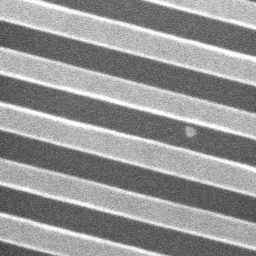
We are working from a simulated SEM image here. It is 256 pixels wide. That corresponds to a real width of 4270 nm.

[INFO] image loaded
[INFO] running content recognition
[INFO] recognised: lines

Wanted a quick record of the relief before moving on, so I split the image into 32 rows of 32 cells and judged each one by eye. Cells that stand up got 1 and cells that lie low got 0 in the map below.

11111100000000000000111111111111
11111111110000000000000011111111
11111111111111000000000000011111
00001111111111111100000000000001
00000000111111111111110000000000
00000000000011111111111110000000
11000000000000001111111111111000
11111100000000000000111111111111
11111111110000000000000111111111
01111111111111000000000000011111
00000111111111111000000000000001
00000000011111111111100000000000
00000000000001111111111110000000
11100000000000000111111111111000
11111110000000000000111111111111
11111111111000000000000001111111
01111111111111000000000000001111
00000111111111111110000000000000
00000000011111111111110000000000
00000000000001111111111111000000
11100000000000001111111111111100
11111110000000000000111111111111
11111111110000000000000011111111
01111111111111000000000000001111
00000111111111111100000000000000
00000000011111111111110000000000
00000000000001111111111111000000
11110000000000000111111111111100
11111111000000000000011111111111
11111111111000000000000001111111
00111111111111100000000000000111
00000111111111111110000000000000